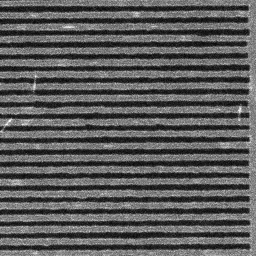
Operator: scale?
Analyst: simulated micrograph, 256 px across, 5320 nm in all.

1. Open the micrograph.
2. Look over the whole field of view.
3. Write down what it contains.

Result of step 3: parallel lines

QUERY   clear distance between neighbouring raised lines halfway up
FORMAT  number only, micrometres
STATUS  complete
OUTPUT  0.0909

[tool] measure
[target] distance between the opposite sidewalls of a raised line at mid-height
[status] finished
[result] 153 nm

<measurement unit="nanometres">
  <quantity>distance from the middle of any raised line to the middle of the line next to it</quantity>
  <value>248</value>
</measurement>